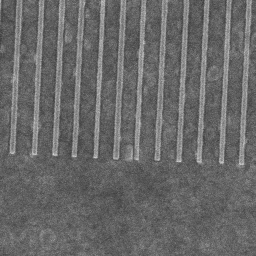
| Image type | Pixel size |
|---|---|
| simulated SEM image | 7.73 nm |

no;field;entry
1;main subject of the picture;parallel lines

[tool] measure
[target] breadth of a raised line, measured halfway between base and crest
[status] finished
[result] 31.8 nm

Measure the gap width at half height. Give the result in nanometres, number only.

125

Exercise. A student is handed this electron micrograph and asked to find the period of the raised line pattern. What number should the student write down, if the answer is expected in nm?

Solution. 161